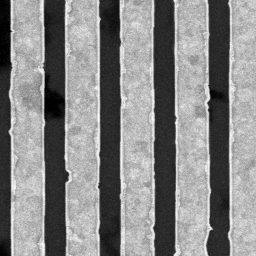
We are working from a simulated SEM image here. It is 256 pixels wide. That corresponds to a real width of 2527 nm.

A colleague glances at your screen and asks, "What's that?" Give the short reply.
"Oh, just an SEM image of parallel lines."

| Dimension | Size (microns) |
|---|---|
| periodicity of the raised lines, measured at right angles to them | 0.54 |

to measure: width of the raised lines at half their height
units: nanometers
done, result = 317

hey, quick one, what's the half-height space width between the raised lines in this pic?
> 228 nanometers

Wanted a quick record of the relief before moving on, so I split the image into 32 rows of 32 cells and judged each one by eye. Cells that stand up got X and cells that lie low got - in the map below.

-XXXX---XXXX---XXXX---XXXX---XXX
-XXXX---XXXX---XXXX---XXXX---XXX
--XXX---XXXX---XXXX---XXXX---XXX
--XXX---XXXX---XXXX---XXXX---XXX
--XXX---XXXX---XXXX---XXXX---XXX
--XXX---XXXX---XXXX---XXXX---XXX
--XXX---XXXX---XXXX---XXXX---XXX
--XXX---XXXX---XXXX---XXXX---XXX
--XXX---XXXX---XXXX---XXXX---XXX
--XXX---XXXX---XXXX---XXXX---XXX
--XXX---XXXX---XXXX---XXXX---XXX
-XXXX---XXXX---XXXX---XXXX---XXX
-XXXX---XXXX---XXXX---XXXX---XXX
--XXX---XXXX---XXXX---XXXX---XXX
--XXX---XXXX---XXXX---XXXX---XXX
--XXX---XXXX---XXXX---XXXX---XXX
-XXXX---XXXX---XXXX---XXXX---XXX
--XXX---XXXX---XXXX---XXXX---XXX
--XXX---XXXX---XXXX---XXXX---XXX
--XXX---XXXX---XXXX---XXXX---XXX
--XXX---XXXX---XXXX---XXXX---XXX
--XXX----XXX---XXXX---XXXX---XXX
--XXX----XXX---XXXX---XXXX---XXX
--XXX---XXXX---XXXX---XXXX---XXX
--XXX---XXXX---XXXX---XXXX---XXX
--XXX---XXXX---XXXX---XXXX---XXX
--XXX---XXXX---XXXX---XXXX---XXX
--XXX---XXXX---XXXX---XXXX---XXX
--XXX---XXXX---XXXX---XXXX---XXX
--XXX---XXXX---XXXX---XXXX---XXX
--XXX---XXXX---XXXX---XXXX---XXX
--XXX---XXXX---XXXX---XXXX---XXX